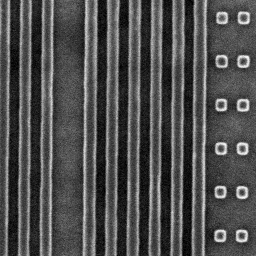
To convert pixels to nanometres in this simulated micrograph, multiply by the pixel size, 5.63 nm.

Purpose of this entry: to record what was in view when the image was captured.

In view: wiring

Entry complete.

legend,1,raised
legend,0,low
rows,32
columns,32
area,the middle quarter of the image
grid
00000111000110001110001100011100
00000111000110001110001100011100
00000111000110001110001100011100
00000111000110001110001100011100
00000111000110001110001100011100
00000111000110001110001100011100
00000111000110001110001100011100
00000111000110001110001100011100
00000111000110001110001100011100
00000111000110001110001100011100
00000111000110001110001100011100
00000111000110001110001100011100
00000111000110001110001100011100
00000111000110001110001100011100
00000111000110001110001100011100
00000111000110001110001100011100
00000111000110001110001100011100
00000111000110001110001100011100
00000111000110001110001100011100
00000111000110001110001100011100
00000111000110001110001100011100
00000111000110001110001100011100
00000111000110001110001100011100
00000111000110001110001100011100
00000111000110001110001100011100
00000111000110001110001100011100
00000111000110001110001100011100
00000111000110001110001100011100
00000111000110001110001100011100
00000111000110001110001100011100
00000111000110001110001100011100
00000111000110001110001100011100